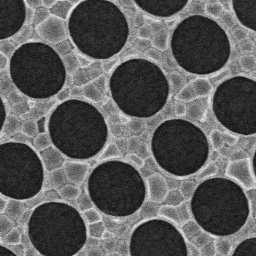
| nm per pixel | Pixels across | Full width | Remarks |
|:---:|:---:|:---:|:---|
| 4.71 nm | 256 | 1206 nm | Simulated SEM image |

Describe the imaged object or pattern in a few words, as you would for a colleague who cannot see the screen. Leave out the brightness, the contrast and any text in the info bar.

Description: holes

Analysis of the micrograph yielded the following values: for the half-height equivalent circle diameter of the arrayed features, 274 nm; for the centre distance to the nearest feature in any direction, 0.337 micrometres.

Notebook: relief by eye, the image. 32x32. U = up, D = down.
DDDUUUUUUUDDDDUUUDDDDDDUUUUUUDDD
DDDUUUUUUDDDDDDUUUDDDDUUUUUUUDDD
DDDUUUUUUDDDDDDDUUUUUUUDDDDUUUDD
DDDUUUUUUDDDDDDDUUUUUUDDDDDDUUUD
DUUUUUUUUDDDDDDDUUUUUDDDDDDDUUUU
UUUDDDUUUDDDDDDDUUUUUDDDDDDDDUUU
UUDDDDDUUUDDDDDUUUUUUUDDDDDDDUUU
UDDDDDDDUUUUUUUUDDUUUUDDDDDDUUUU
UDDDDDDDUUUUUUUDDDDDUUUDDDDDUUUU
UDDDDDDDUUUUUUDDDDDDDUUUUUUUUUUU
UUDDDDDDUUUUUUDDDDDDDUUUUUUUDDDD
UUUDDDDUUUUUUUDDDDDDDUUUUUUDDDDD
UUUUUUUUUDUUUUDDDDDDDUUUUUUDDDDD
DUUUUUUDDDDDUUUDDDDDUUUUUUUDDDDD
DUUUUUDDDDDDDUUUDDDUUUUUUUUDDDDD
UUUUUUDDDDDDDUUUUUUUDDDDUUUUDDDD
UUUUUUDDDDDDDUUUUUUDDDDDDUUUUDDD
UUUUUUDDDDDDDUUUUUUDDDDDDDUUUUUU
DDDDUUUDDDDDDUUUUUUDDDDDDDUUUUUU
DDDDDUUUDDDDUUUUUUUDDDDDDDUUUUUU
DDDDDUUUUUUUUDDDUUUUDDDDDUUUUUUU
DDDDDUUUUUUUDDDDDUUUUDDDUUUUUUUU
DDDDDUUUUUUDDDDDDDUUUUUUUUDDDUUU
DDDDDUUUUUUDDDDDDDUUUUUUUDDDDDUU
UDDDUUUUUUUDDDDDDDUUUUUUDDDDDDDU
UUUUUDDDUUUUDDDDDDUUUUUUDDDDDDDU
UUUUDDDDDDUUUDDDDUUUUUUUDDDDDDDU
UUUUDDDDDDUUUUUUUUUDUUUUDDDDDDDU
UUUUDDDDDDDUUUUUUDDDDDUUUDDDDDUU
UUUUDDDDDDDUUUUUDDDDDDDUUUUDUUUU
UUUUDDDDDDDUUUUUDDDDDDDUUUUUUUDD
DDUUUDDDDDUUUUUUDDDDDDDUUUUUUDDD